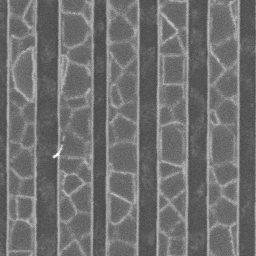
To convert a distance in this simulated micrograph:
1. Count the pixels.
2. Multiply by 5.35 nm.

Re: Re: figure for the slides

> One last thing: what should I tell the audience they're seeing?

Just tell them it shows parallel lines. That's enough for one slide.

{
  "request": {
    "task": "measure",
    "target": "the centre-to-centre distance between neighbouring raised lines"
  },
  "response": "0.269 micrometres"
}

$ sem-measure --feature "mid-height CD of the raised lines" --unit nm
162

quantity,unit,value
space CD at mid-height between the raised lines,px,19.9